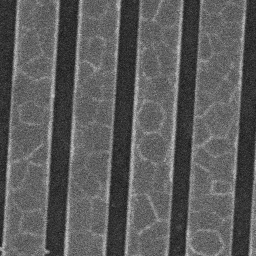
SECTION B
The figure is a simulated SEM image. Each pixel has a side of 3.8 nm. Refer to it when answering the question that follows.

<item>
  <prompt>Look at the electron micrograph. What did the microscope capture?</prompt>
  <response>one or a few lines or trenches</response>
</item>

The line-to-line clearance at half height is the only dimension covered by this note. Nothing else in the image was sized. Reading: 78.3 nm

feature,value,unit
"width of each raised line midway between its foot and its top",156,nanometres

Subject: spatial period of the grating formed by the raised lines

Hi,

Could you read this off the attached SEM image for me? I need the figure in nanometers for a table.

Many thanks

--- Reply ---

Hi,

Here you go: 235